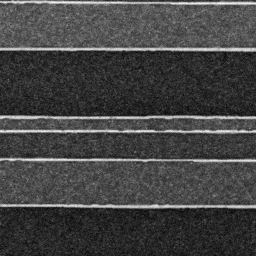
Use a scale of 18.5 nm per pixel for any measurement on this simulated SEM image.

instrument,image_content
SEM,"lines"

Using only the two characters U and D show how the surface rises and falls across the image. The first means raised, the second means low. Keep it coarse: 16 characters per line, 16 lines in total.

UUUUUUUUUUUUUUUU
UUUUUUUUUUUUUUUU
UUUUUUUUUUUUUUUU
DDDDDDDDDDDDDDDD
DDDDDDDDDDDDDDDD
DDDDDDDDDDDDDDDD
DDDDDDDDDDDDDDDD
UUUUUUUUUUUUUUUU
UUUUUUUUUUUUUUUU
UUUUUUUUUUUUUUUU
UUUUUUUUUUUUUUUU
UUUUUUUUUUUUUUUU
UUUUUUUUUUUUUUUU
DDDDDDDDDDDDDDDD
DDDDDDDDDDDDDDDD
DDDDDDDDDDDDDDDD